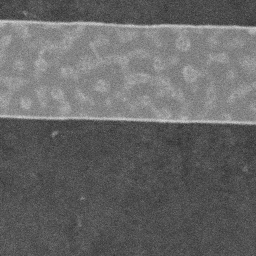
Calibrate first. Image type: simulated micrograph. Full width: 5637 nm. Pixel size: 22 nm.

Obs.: one or a few lines or trenches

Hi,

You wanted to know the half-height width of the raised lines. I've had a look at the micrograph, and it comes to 2100 nm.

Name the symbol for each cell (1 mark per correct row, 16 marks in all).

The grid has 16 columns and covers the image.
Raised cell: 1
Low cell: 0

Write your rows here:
0000000000000000
1111110000000000
1111111111111111
1111111111111111
1111111111111111
1111111111111111
1111111111111111
0000000001111111
0000000000000000
0000000000000000
0000000000000000
0000000000000000
0000000000000000
0000000000000000
0000000000000000
0000000000000000